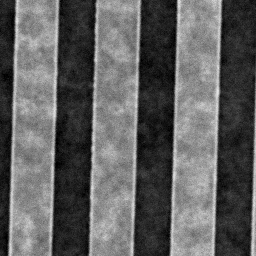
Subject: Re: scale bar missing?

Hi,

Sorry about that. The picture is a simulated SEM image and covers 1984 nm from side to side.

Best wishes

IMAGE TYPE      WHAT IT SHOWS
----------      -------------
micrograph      one or a few lines or trenches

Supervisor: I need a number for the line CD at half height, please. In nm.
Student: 327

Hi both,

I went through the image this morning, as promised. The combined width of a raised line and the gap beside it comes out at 0.627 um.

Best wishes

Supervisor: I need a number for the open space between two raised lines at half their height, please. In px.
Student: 38.6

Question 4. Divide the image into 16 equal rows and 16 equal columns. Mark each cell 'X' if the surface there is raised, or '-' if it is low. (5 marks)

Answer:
-XXX--XXX--XXX--
-XXX--XXX--XXX--
-XXX--XXX--XXX--
-XXX--XXX--XXX--
-XX---XXX--XXX--
-XX---XXX--XXX--
-XX---XXX--XXX--
-XX---XXX--XXX--
-XX---XX---XXX--
-XX---XX---XXX--
-XX---XX---XX---
-XX---XX---XX---
-XX---XX---XX---
-XX---XX---XX---
-XX---XX---XX---
-XX---XX---XX---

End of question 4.